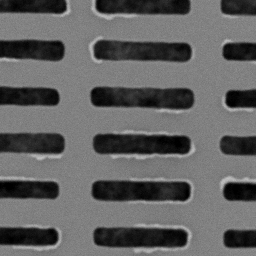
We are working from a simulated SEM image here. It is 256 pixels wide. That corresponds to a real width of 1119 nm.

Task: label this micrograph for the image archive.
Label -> holes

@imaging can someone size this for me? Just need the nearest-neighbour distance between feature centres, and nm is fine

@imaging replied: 204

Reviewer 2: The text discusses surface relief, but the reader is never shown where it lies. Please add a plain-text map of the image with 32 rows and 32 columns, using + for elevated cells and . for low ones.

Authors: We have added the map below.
........++++............++++....
........++++............++++....
++++++++++++++++++++++++++++++++
++++++++++++++++++++++++++++++++
++++++++++++++++++++++++++++++++
........++++............++++....
........++++............++++....
++++....+++++..........++++++...
++++++++++++++++++++++++++++++++
++++++++++++++++++++++++++++++++
++++++++++++++++++++++++++++++++
.......++++.............+++++...
.......++++.............++++....
++++++++++++++++++......+++++...
++++++++++++++++++++++++++++++++
++++++++++++++++++++++++++++++++
++++++++++++++++++++++++++++++++
........++++............++++....
........++++............++++....
+++++++++++++++++++++++++++++++.
++++++++++++++++++++++++++++++++
++++++++++++++++++++++++++++++++
++++++++++++++++++++++++++++++++
.......++++.............++++....
.......+++++............++++....
++++++++++++++++++++++++++++++++
++++++++++++++++++++++++++++++++
++++++++++++++++++++++++++++++++
....++++++++.....+..++++++++++++
.......+++++...........+++++....
.......+++++...........+++++....
++++++++++++++++++++++++++++++++